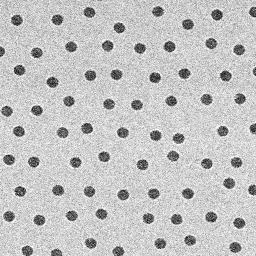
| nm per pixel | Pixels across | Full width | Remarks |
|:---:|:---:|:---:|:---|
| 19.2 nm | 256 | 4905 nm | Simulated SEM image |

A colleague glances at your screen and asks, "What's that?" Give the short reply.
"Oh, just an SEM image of a regular array of holes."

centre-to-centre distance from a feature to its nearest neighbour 0.533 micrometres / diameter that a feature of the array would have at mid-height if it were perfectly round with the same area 0.233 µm